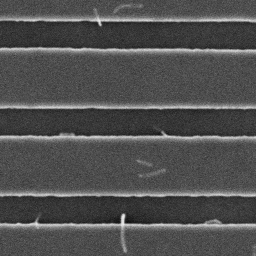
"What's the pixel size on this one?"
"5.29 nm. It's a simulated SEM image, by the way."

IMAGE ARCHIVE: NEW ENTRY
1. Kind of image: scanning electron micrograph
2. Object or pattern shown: lines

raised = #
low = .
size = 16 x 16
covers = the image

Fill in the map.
################
................
................
################
################
################
################
................
..........#.....
################
################
################
................
................
################
################